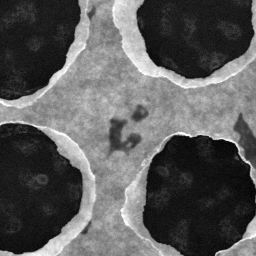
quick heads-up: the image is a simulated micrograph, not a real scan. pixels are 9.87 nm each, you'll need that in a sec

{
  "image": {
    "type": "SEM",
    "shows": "holes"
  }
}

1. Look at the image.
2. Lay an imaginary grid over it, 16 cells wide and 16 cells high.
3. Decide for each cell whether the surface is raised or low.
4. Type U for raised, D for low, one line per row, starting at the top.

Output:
DDDDDUUUDDDDDDDD
DDDDDUUUDDDDDDDD
DDDDDUUUUDDDDDDD
DDDDUUUUUDDDDDDD
DDDDUUUUUUDDDDDU
DDDUUUUUUUUUUUUU
UUUUUUUUUUUUUUUU
UUUUUUUUUUUUUUUU
DDDUUUUUUUUDDUUU
DDDDUUUUUUDDDDDU
DDDDDUUUUDDDDDDD
DDDDDDUUUDDDDDDD
DDDDDDUUDDDDDDDD
DDDDDUUUDDDDDDDD
DDDDUUUUUDDDDDDU
DDDUUUUUUUDDDDUU